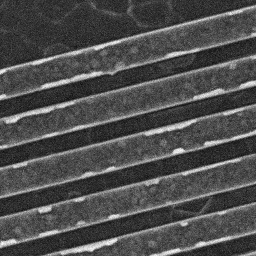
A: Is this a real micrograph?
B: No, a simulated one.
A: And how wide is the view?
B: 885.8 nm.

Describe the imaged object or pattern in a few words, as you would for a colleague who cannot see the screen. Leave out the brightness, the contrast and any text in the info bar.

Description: parallel lines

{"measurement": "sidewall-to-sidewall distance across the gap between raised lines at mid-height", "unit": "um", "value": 0.0645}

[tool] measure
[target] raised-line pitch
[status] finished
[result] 165 nm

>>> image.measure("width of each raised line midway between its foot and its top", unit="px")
28.9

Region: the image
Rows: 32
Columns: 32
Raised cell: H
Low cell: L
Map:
LLLLLLLLLLLLLLLLLLLLLLLLLLLLLLLL
LLLLLLLLLLLLLLLLLLLLLLLLLLLLLHHH
LLLLLLLLLLLLLLLLLLLLLLLLLHHHHHHH
LLLLLLLLLLLLLLLLLLLLLHHHHHHHHHHH
LLLLLLLLLLLLLLLLLHHHHHHHHHHHHHHH
LLLLLLLLLLLLLHHHHHHHHHHHHHHHLLLL
LLLLLLLLLHHHHHHHHHHHHHHHLLLLLLLL
LLLLLHHHHHHHHHHHHHHHLLLLLLLLLLHH
LHHHHHHHHHHHHHHHLLLLLLLLLLHHHHHH
HHHHHHHHHHHHLLLLLLLLLLHHHHHHHHHH
HHHHHHHHLLLLLLLLLLHHHHHHHHHHHHHH
HHHHLLLLLLLLLLHHHHHHHHHHHHHHLLLL
LLLLLLLLLLHHHHHHHHHHHHHHLLLLLLLL
LLLLLLHHHHHHHHHHHHHHLLLLLLLLLLHH
LLHHHHHHHHHHHHHHLLLLLLLLLLHHHHHH
HHHHHHHHHHHHLLLLLLLLLLHHHHHHHHHH
HHHHHHHHLLLLLLLLLLHHHHHHHHHHHHHH
HHHHLLLLLLLLLLHHHHHHHHHHHHHHHLLL
LLLLLLLLLLHHHHHHHHHHHHHHHLLLLLLL
LLLLLLHHHHHHHHHHHHHHHLLLLLLLLLLH
LLHHHHHHHHHHHHHHHLLLLLLLLLLHHHHH
HHHHHHHHHHHHHLLLLLLLLLLHHHHHHHHH
HHHHHHHHHLLLLLLLLLLHHHHHHHHHHHHH
HHHHHLLLLLLLLLLHHHHHHHHHHHHHHHLL
HLLLLLLLLLLHHHHHHHHHHHHHHHLLLLLL
LLLLLLLHHHHHHHHHHHHHHHLLLLLLLLLH
LLLHHHHHHHHHHHHHHHLLLLLLLLLHHHHH
HHHHHHHHHHHHHHLLLLLLLLLHHHHHHHHH
HHHHHHHHHHLLLLLLLLLHHHHHHHHHHHHH
HHHHHHLLLLLLLLLHHHHHHHHHHHHHHHLL
HHLLLLLLLLLHHHHHHHHHHHHHHHLLLLLL
LLLLLLLHHHHHHHHHHHHHHHLLLLLLLLLL